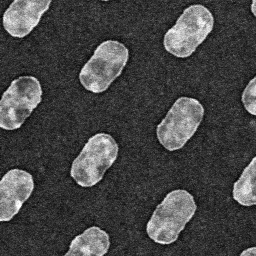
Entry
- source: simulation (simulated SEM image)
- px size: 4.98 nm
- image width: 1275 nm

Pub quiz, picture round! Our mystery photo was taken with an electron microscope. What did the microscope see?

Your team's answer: raised bodies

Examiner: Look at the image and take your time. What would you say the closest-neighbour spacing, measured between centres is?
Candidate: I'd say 461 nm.